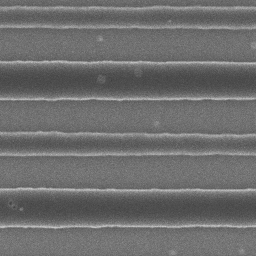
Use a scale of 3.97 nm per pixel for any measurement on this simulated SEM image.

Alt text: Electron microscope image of lines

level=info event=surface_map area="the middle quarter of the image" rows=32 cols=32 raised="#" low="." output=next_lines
################################
################################
################################
################################
################################
################################
################################
################################
################################
................................
................................
................................
................................
................................
................................
................................
................................
#..#######......................
################################
################################
################################
################################
#############################.##
................................
................................
................................
................................
................................
................................
................................
................................
###..###....#.........#.........